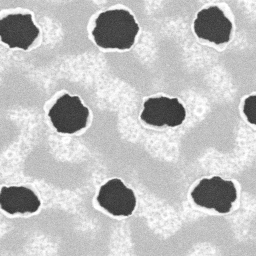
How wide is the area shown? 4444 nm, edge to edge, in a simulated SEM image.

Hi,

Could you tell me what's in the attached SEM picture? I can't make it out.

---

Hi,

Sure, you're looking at holes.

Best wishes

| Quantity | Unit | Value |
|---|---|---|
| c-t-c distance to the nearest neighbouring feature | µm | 1.67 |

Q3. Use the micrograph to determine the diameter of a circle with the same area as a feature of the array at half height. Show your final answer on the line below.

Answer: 692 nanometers